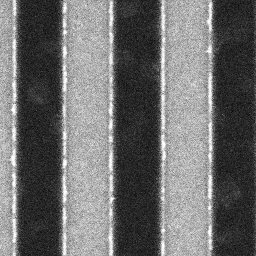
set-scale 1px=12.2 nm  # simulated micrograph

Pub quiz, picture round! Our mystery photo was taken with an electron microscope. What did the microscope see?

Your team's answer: one or a few lines or trenches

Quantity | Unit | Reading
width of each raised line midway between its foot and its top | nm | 654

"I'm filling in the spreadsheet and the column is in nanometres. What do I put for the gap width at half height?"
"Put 546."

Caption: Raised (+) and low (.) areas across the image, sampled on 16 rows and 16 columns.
.+++...+++...+++
.+++...+++...+++
.+++...+++...+++
.+++...+++...+++
.+++...+++...+++
.+++...+++...+++
.+++...+++...+++
.+++...+++...+++
.+++...+++...+++
.+++...+++...+++
.+++...+++...+++
.+++...+++...+++
.+++...+++...+++
.+++...+++...+++
.+++...+++...+++
.+++...+++...+++